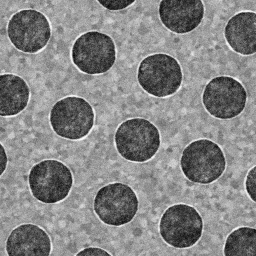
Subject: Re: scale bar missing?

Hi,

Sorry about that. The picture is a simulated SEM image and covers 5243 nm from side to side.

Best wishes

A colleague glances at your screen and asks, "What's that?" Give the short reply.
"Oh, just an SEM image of a regular array of holes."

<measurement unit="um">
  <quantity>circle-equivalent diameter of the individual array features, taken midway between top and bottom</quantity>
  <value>0.909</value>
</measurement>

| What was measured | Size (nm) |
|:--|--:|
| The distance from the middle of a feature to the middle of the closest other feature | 1390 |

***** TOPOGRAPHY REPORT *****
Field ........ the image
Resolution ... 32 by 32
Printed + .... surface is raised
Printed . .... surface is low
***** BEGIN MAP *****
+++++++++++++...++++.....+++++++
++...+++++++++++++++......++++..
+.....++++++++++++++.....++++...
+.....+++++++++++++++...++++....
+.....++++....++++++++++++++....
++....+++.....+++++++++++++++...
+++..++++.....++++++++++++++++..
+++++++++.....++++....++++++++++
++++++++++....+++......+++++++++
..+++++++++++++++......+++++++++
...++++++++++++++......+++....++
....++++++++++++++....+++......+
....++++...++++++++++++++......+
...++++.....++++++++++++++.....+
.+++++......+++++++++++++++...++
++++++......+++....+++++++++++++
+++++++....++++.....++++++++++++
++++++++++++++......+++++.++++++
+++++++++++++++.....+++.....++++
.++++++++++++++....++++.....++++
.++++...+++++++++++++++.....++++
++++.....++++++++++++++.....+++.
++++.....+++++++++++++++...++++.
++++.....++++...+++++++++++++++.
++++....++++.....++++++++++++++.
++++++++++++.....+++++.+++++++++
++++++++++++.....++++....+++++++
+++++++++++++...++++.....+++++++
++...+++++++++++++++.....+++++..
+.....++++++++++++++.....++++...
+.....+++++++++++++++...++++....
+.....++++...+++++++++++++++....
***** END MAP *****